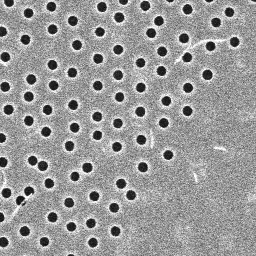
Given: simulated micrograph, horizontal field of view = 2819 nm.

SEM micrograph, a regular array of holes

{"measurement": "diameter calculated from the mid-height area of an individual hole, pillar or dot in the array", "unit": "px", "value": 9.96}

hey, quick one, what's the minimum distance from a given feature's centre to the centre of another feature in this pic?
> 236 nm